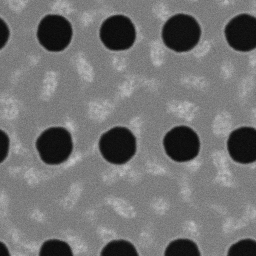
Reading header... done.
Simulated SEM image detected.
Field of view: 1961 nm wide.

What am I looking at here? holes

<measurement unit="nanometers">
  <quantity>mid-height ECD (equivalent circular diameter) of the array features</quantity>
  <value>279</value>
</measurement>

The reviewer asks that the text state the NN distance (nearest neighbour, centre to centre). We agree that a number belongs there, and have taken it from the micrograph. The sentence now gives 485 nanometres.